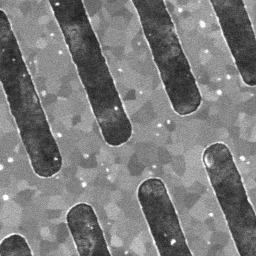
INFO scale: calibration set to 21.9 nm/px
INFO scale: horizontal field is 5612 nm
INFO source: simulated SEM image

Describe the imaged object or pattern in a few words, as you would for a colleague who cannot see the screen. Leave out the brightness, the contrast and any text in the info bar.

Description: holes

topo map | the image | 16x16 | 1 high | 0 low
1110011100111001
0111001110011100
0111001110011100
0111001111001110
0011100111001110
0011100111001111
1001110011101111
1001110011111111
1001110011111111
1100111111111011
1100111111111001
1111111110111001
1111111110011100
1111001110011100
1111001110011100
0011100111001110